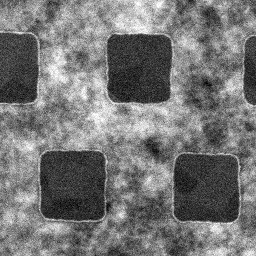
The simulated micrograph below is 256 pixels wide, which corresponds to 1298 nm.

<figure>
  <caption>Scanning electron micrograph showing raised bodies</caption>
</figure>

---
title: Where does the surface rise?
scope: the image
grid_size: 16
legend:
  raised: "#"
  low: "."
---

................
................
##.....####....#
##.....####....#
##.....####....#
##.....####....#
##.......#......
................
................
...###..........
..#####....####.
..#####....####.
...####....####.
...###.....####.
................
................